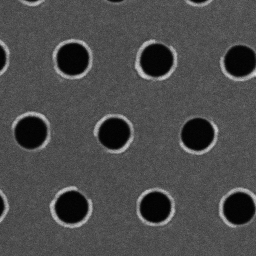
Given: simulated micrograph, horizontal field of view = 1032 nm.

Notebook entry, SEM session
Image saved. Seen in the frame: a regular array of holes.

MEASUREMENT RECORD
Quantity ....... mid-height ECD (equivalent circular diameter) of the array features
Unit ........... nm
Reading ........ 128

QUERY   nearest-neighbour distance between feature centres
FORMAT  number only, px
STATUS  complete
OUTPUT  83.5